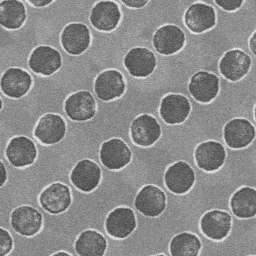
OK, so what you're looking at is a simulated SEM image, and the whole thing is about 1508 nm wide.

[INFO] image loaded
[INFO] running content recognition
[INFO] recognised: a regular array of holes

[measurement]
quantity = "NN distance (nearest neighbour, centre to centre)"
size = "36.7 pixels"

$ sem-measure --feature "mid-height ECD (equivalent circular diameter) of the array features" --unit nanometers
184